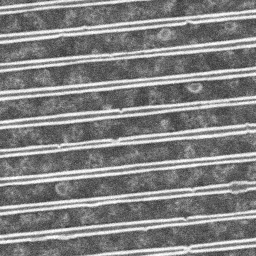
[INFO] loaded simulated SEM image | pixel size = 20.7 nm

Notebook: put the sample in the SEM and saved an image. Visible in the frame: parallel lines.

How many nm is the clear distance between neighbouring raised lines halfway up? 464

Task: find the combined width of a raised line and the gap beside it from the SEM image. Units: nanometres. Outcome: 590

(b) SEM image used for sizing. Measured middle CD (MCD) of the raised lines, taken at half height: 116 nanometers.